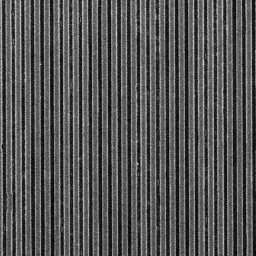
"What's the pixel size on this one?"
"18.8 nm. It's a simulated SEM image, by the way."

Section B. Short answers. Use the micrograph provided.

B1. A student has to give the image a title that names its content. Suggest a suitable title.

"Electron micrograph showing parallel lines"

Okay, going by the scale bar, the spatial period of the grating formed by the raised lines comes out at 180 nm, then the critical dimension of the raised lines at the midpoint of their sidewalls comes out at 101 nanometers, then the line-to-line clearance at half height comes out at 82.1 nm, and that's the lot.